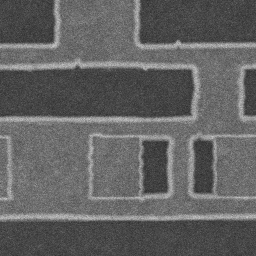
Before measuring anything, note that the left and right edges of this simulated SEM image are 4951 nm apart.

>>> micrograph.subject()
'one or a few lines or trenches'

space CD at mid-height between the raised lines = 1060 nanometers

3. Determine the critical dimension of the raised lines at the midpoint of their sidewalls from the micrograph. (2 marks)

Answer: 0.402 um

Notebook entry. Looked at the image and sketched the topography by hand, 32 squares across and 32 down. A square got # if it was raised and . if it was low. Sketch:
.......##########...............
.......##########...............
.......##########...............
.......##########...............
.......##########...............
.......##########...............
################################
################################
........................#######.
........................######..
.........................#####..
.........................#####..
........................######..
........................######..
........................######..
################################
################################
############.#.......###...#####
.###########.........###.....###
.###########.#.......###...###..
.################....###...###.#
###############......###....#..#
################.....###....#...
############.##......###...#.###
#################....###...#####
################################
################################
................................
................................
................................
................................
................................